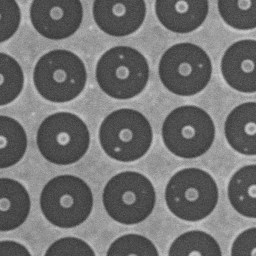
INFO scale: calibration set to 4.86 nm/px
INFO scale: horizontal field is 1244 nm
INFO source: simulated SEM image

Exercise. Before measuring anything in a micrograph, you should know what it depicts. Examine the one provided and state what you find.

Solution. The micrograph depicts an array of small figures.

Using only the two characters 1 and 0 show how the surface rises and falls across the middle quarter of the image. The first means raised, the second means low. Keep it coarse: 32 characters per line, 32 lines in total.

00000111000000000000011000000111
00000011000001110000011000000111
00000011000001110000011100000110
00000011000000000000011100000000
00000011000000000000011100000000
00000011100000000000011110000000
00000111110000000000111111000000
00000111110000000000111111100000
00011111111100000011111111111111
00111111111111111111111111111111
11111111111111111111111111111000
11111111111110000011111111100000
00011111111000000001111111000000
00001111110000000000011110000000
00000111100000000000011110000000
00000011100000000000001110000000
00000011000000010000001100000011
00000011000000111000001100000011
10000001000000111000001100000000
00000001100000000000001110000000
00000011100000000000001110000000
00000011100000000000011111000000
00000111110000000000011111100000
00001111111000000000111111111000
00011111111111000011111111111111
11111111111111111111111111111111
11111111111111100111111111110000
01111111111110000000111111100000
00001111111100000000011111100000
00000111111000000000001111000000
00000011110000000000001110000000
00000001110000000000000110000001